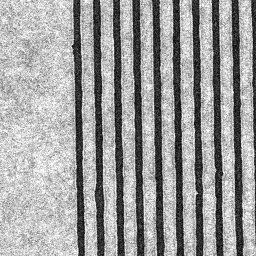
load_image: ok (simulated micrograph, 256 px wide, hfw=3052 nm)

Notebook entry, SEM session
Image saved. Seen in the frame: parallel lines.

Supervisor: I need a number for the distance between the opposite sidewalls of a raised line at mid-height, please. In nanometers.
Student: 143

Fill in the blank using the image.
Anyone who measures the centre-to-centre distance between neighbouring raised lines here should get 236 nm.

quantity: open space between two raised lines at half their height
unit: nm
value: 98.3